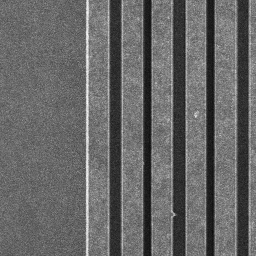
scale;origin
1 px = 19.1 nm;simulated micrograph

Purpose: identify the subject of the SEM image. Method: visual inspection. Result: parallel lines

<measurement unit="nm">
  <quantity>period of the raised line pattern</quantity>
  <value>606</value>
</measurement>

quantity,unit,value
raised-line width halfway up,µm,0.402